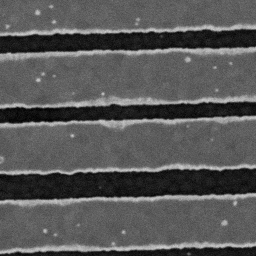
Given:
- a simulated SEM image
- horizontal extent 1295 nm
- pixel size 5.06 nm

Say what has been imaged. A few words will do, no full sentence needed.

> lines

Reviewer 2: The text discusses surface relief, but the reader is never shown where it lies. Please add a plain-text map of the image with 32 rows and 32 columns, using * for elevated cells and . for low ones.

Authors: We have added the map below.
********************************
********************************
********************************
******************************..
................................
................................
...........*****.***************
********************************
********************************
********************************
********************************
********************************
******************************..
................................
................................
..******************************
********************************
********************************
********************************
********************************
********************************
**********......................
................................
................................
..........................*..***
********************************
********************************
********************************
********************************
********************************
********************************
*...............................